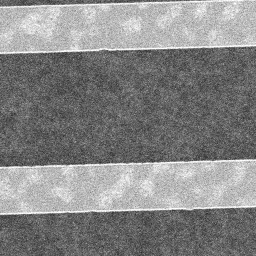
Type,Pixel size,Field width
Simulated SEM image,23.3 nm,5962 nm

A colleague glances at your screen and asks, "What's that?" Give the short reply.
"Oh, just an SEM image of one or a few lines or trenches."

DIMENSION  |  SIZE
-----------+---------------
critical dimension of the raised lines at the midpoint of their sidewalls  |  1070 nanometers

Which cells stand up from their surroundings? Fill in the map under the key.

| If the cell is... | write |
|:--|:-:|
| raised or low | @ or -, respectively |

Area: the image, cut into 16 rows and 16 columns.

@@@@@@@@@@@@@@@@
@@@@@@@@@@@@@@@@
@@@@@@@@@@@@@@@@
----------------
----------------
----------------
----------------
----------------
----------------
----------------
@@@@@@@@@@@@@@@@
@@@@@@@@@@@@@@@@
@@@@@@@@@@@@@@@@
----------------
----------------
----------------